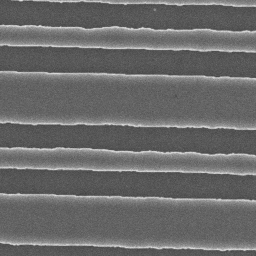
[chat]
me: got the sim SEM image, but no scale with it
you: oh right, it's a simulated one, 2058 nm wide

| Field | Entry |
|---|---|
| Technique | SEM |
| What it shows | lines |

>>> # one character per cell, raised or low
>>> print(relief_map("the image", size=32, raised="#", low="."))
...............#....############
................................
................................
##########..####................
################################
################################
................................
................................
................................
#####################...........
################################
################################
################################
################################
################################
....#..#########################
................................
................................
................................
################################
################################
......................##########
................................
................................
##########......................
################################
################################
################################
################################
################################
.###############################
................................